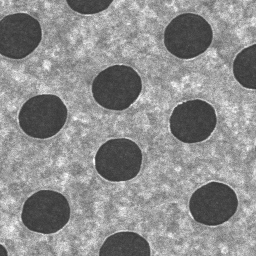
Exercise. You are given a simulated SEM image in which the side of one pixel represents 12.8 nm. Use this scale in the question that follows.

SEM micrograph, holes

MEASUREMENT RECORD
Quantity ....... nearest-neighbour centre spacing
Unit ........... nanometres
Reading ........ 1070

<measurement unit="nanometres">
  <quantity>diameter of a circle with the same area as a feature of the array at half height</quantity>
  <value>598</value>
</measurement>